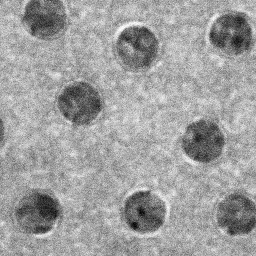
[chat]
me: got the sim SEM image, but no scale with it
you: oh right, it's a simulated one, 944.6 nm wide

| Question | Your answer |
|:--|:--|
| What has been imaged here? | raised bodies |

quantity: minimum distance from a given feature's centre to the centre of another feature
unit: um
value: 0.34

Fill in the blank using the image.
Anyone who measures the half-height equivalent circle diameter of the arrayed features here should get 170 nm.